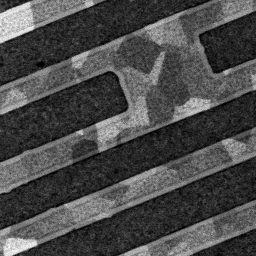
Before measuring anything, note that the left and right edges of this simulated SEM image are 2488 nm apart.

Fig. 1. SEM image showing one or a few lines or trenches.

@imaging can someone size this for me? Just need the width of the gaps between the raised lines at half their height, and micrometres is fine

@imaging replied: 0.433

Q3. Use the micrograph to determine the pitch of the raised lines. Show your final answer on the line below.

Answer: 66.1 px